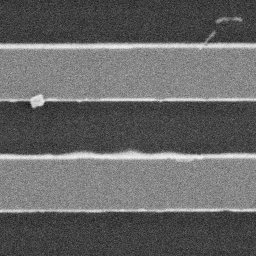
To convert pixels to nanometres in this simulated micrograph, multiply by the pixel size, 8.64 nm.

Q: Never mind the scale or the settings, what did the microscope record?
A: lines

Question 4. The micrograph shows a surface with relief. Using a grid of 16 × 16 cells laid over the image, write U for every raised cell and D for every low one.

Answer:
DDDDDDDDDDDDDDDD
DDDDDDDDDDDDDDDD
DDDDDDDDDDDDDDDD
UUUUUUUUUUUUUUUU
UUUUUUUUUUUUUUUU
UUUUUUUUUUUUUUUU
DDUDDDDDDDDDDDDD
DDDDDDDDDDDDDDDD
DDDDDDDDDDDDDDDD
DDDDDDDDDDDDDDDD
UUUUUUUUUUUUUUUU
UUUUUUUUUUUUUUUU
UUUUUUUUUUUUUUUU
DDDDDDDDDDDDDDDD
DDDDDDDDDDDDDDDD
DDDDDDDDDDDDDDDD